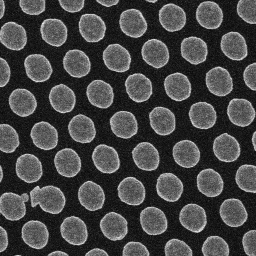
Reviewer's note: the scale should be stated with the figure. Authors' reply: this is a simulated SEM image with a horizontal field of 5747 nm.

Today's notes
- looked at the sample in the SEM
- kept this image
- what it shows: a regular array of raised bodies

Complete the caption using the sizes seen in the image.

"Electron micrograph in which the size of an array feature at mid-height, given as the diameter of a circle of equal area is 610 nm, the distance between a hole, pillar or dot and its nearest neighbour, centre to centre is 845 nanometers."